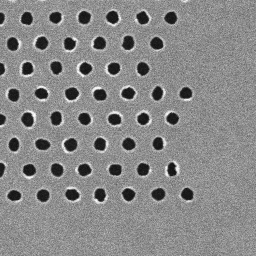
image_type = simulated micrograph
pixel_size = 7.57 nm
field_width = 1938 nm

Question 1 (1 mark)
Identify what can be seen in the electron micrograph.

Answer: a regular array of holes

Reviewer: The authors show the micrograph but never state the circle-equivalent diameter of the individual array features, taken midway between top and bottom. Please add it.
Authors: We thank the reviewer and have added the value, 94 nm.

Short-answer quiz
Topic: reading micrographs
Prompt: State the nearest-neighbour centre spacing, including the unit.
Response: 0.215 micrometres